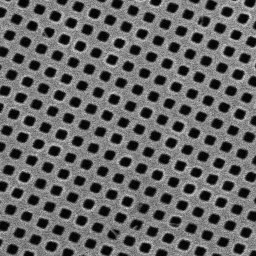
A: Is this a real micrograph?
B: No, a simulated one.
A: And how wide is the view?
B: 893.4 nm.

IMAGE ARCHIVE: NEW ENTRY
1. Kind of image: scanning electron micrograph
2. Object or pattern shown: a regular array of holes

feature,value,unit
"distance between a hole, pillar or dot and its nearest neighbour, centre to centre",0.0602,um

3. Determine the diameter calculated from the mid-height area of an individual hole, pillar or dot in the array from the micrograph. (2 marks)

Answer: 35.9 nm